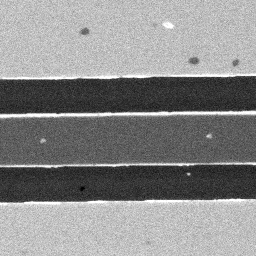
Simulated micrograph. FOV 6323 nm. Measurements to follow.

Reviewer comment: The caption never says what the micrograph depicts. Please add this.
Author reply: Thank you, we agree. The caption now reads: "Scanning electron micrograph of lines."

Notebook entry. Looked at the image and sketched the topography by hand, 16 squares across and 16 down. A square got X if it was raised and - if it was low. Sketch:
XXXXXXXXXXXXXXXX
XXXXXXXXXXXXXXXX
XXXXXXXXXXXXXXXX
XXXXXXXXXXXXXXXX
XXXXXXXXXXXXXXXX
----------------
----------------
XXXXXXXXXXXXXXXX
XXXXXXXXXXXXXXXX
XXXXXXXXXXXXXXXX
----------------
----------------
----------------
XXXXXXXXXXXXXXXX
XXXXXXXXXXXXXXXX
XXXXXXXXXXXXXXXX